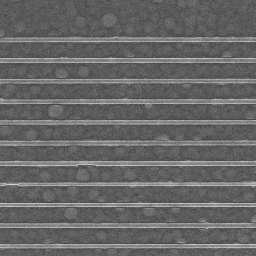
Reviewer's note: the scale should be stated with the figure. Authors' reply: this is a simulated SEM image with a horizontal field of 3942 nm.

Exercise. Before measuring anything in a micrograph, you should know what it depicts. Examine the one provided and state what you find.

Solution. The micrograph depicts parallel lines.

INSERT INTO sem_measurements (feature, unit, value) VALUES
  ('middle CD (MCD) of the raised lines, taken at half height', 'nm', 63.5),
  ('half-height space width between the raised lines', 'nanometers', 254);